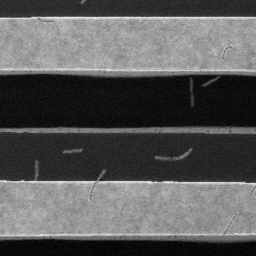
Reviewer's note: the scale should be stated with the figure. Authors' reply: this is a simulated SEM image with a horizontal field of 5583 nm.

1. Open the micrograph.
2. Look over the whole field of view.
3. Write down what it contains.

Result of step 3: lines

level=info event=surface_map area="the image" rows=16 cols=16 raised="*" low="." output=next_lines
****************
****************
****************
****************
................
................
................
................
****************
****************
****************
****************
****************
****************
****************
................